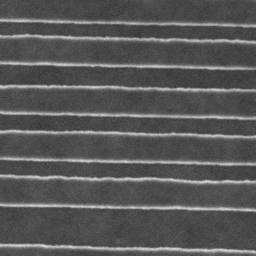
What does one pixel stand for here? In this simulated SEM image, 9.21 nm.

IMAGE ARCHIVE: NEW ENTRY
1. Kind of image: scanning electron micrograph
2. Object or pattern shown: lines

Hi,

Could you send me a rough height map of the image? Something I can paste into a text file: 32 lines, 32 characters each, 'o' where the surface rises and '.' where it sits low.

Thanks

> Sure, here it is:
oooooooooooooooooooooooooooooooo
oooooooooooooooooooooooooooooooo
oooooooooooooooooooooooooooooooo
................................
.oooo...........................
oooooooooooooooooooooooooooooooo
oooooooooooooooooooooooooooooooo
oooooooooooooooooooooooooooooooo
........................oooooooo
................................
................................
oooooooooooooooooooooooooooooooo
oooooooooooooooooooooooooooooooo
oooooooooooooooooooooooooooooooo
.................ooooooooooooooo
................................
oooooo...ooo....................
oooooooooooooooooooooooooooooooo
oooooooooooooooooooooooooooooooo
oooooooooooooooooooooooooooooooo
............................o..o
................................
oooooooooooooooooooooo..........
oooooooooooooooooooooooooooooooo
oooooooooooooooooooooooooooooooo
oooooooooooooooooooooooooooooooo
................................
................................
................................
................................
................................
oooooooooooooooooooooooooooooooo